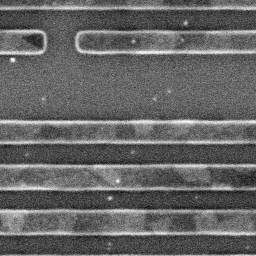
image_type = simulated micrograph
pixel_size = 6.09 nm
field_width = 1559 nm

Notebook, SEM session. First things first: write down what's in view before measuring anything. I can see wiring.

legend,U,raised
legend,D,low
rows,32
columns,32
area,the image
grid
UUUUUUUUUUUUUUUUUUUUUUUUUUUUUUUU
DDDDDDDDDDDDDDDDDDDDDDDDDDDDDDDD
DDDDDDDDDDDDDDDDDDDDDDDDDDDDDDDD
DDDDDDDDDDDDDDDDDDDDDDDDDDDDDDDD
UUUUUUDDDDUUUUUUUUUUUUUUUUUUUUUU
UUUUUUDDDDUUUUUUUUUUUUUUUUUUUUUU
UUUUUDDDDDUUUUUUUUUUUUUUUUUUUUUU
DDDDDDDDDDDDDDDDDDDDDDDDDDDDDDDD
DDDDDDDDDDDDDDDDDDDDDDDDDDDDDDDD
DDDDDDDDDDDDDDDDDDDDDDDDDDDDDDDD
DDDDDDDDDDDDDDDDDDDDDDDDDDDDDDDD
DDDDDDDDDDDDDDDDDDDDDDDDDDDDDDDD
DDDDDDDDDDDDDDDDDDDDDDDDDDDDDDDD
DDDDDDDDDDDDDDDDDDDDDDDDDDDDDDDD
DDDDDDDDDDDDDDDDDDDDDDDDDDDDDDDD
UUUUUUUUUUUUUUUUUUUUUUUUUUUUUUUU
UUUUUUUUUUUUUUUUUUUUUUUUUUUUUUUU
UUUUUUUUUUUUUUUUUUUUUUUUUUUUUUUU
DDDDDDDDDDDDDDDDDDDDDDDDDDDDDDDD
DDDDDDDDDDDDDDDDDDDDDDDDDDDDDDDD
DDDDDDDDDDDDDDDDDDDDDDDDDDDDDDDD
UUUUUUUUUUUUUUUUUUUUUUUUUUUUUUUU
UUUUUUUUUUUUUUUUUUUUUUUUUUUUUUUU
UUUUUUUUUUUUUUUUUUUUUUUUUUUUUUUU
DDDDDDDDDDDDDDDDDDDDDDDDDDDDDDDD
DDDDDDDDDDDDDDDDDDDDDDDDDDDDDDDD
UUUUUUUUUUUUUUUUUUUUUUUUUUUUUUUU
UUUUUUUUUUUUUUUUUUUUUUUUUUUUUUUU
UUUUUUUUUUUUUUUUUUUUUUUUUUUUUUUU
DDDDDDDDDDDDDDDDDDDDDDDDDDDDDDDD
DDDDDDDDDDDDDDDDDDDDDDDDDDDDDDDD
DDDDDDDDDDDDDDDDDDDDDDDDDDDDDDDD